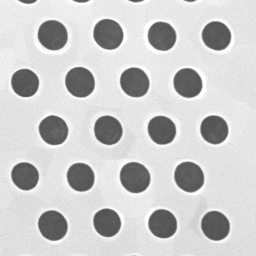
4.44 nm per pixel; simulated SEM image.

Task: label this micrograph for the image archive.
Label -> a regular array of holes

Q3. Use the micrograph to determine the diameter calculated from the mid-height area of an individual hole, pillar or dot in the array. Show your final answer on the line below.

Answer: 29.1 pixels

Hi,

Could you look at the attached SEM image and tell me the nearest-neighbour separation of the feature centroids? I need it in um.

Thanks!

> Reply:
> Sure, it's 0.238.